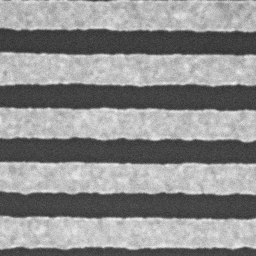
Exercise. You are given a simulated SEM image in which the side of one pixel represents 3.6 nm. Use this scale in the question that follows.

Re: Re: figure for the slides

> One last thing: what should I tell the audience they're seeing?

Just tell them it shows lines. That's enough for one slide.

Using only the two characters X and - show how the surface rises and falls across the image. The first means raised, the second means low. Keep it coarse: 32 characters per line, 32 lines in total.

XXXXXXXXXXXXXXXXXXXXXXXXXXXXXXXX
XXXXXXXXXXXXXXXXXXXXXXXXXXXXXXXX
XXXXXXXXXXXXXXXXXXXXXXXXXXXXXXXX
-XXXXXXXXXX--XXXXXXXXXXXXXXXXXXX
--------------------------------
--------------------------------
--------------------------------
XXXXXXXXXXXXXXXXXXXXXXXXXXXXXXXX
XXXXXXXXXXXXXXXXXXXXXXXXXXXXXXXX
XXXXXXXXXXXXXXXXXXXXXXXXXXXXXXXX
XX---X------XXXXXXXXXXXXXXXXXXXX
--------------------------------
--------------------------------
--------------------------------
XXXXXXXXXXXXXXXXXXXXXXXXXXXXXXXX
XXXXXXXXXXXXXXXXXXXXXXXXXXXXXXXX
XXXXXXXXXXXXXXXXXXXXXXXXXXXXXXXX
------------------------------XX
--------------------------------
--------------------------------
XXXXX--XXXX---------------------
XXXXXXXXXXXXXXXXXXXXXXXXXXXXXXXX
XXXXXXXXXXXXXXXXXXXXXXXXXXXXXXXX
XXXXXXXXXXXXXXXXXXXXXXXXXXXXXXXX
--------------------------------
--------------------------------
--------------------------------
XXXXXXXXXXXXXXXXXXXXXXXXXXX-XX-X
XXXXXXXXXXXXXXXXXXXXXXXXXXXXXXXX
XXXXXXXXXXXXXXXXXXXXXXXXXXXXXXXX
XXXXXXXXXXXXXXXXXXXXXXXXXXXXXXXX
--------------------------------